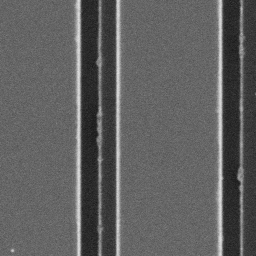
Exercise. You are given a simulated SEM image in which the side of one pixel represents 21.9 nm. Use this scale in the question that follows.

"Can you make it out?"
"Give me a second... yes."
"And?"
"lines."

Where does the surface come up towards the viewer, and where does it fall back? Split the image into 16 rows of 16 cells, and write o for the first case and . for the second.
ooooo..ooooooo..
ooooo..ooooooo..
ooooo..ooooooo..
ooooo..ooooooo..
ooooo..ooooooo..
ooooo..ooooooo..
ooooo..ooooooo..
ooooo..ooooooo..
ooooo..ooooooo..
ooooo..ooooooo..
ooooo..ooooooo..
ooooo..ooooooo..
ooooo..ooooooo..
ooooo..ooooooo..
ooooo..ooooooo..
ooooo..ooooooo..